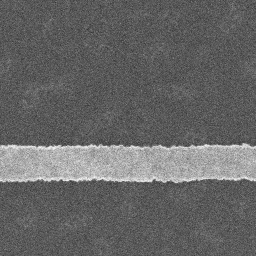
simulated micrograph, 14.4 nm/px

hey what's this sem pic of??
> one or a few lines or trenches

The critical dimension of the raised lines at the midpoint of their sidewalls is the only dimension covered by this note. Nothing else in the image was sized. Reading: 476 nm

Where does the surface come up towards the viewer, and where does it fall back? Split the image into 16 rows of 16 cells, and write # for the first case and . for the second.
................
................
................
................
................
................
................
................
................
################
################
................
................
................
................
................